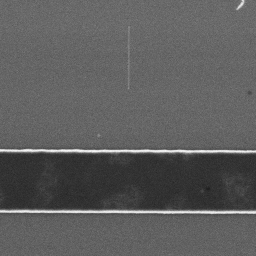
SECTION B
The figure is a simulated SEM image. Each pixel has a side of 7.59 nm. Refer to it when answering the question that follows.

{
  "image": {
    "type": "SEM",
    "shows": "one or a few lines or trenches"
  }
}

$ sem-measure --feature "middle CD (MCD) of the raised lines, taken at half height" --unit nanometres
468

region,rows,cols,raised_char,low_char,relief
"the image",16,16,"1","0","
0000000000000000
0000000000000000
0000000000000000
0000000000000000
0000000000000000
0000000000000000
0000000000000000
0000000000000000
0000000000000000
1111111111111111
1111111111111111
1111111111111111
1111111111111111
0000000000000000
0000000000000000
0000000000000000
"